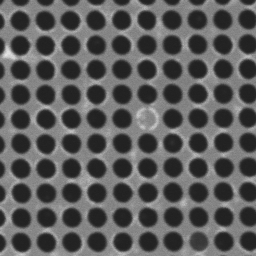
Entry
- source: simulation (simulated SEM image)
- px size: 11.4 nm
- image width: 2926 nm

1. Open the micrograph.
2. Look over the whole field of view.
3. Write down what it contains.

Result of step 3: a regular array of holes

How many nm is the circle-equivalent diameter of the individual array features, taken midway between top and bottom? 233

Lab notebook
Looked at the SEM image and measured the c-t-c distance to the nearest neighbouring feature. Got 280 nm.